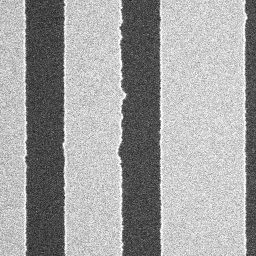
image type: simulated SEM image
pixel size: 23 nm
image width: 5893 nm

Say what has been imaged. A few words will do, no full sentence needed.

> one or a few lines or trenches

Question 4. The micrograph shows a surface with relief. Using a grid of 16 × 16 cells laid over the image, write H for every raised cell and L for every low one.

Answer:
HHLLHHHHLLHHHHHL
HHLLHHHHLLHHHHHL
HHLLHHHHLLHHHHHL
HHLLHHHHLLHHHHHL
HHLLHHHHLLHHHHHL
HHLLHHHHLLHHHHHL
HHLLHHHHLLHHHHHL
HHLLHHHHLLHHHHHL
HHLLHHHHLLHHHHHL
HHLLHHHLLLHHHHHL
HHLLHHHHLLHHHHHL
HHLLHHHHLLHHHHHL
HHLLHHHHLLHHHHHL
HHLLHHHHLLHHHHHL
HHLLHHHHLLHHHHHL
HHLLHHHHLLHHHHHL